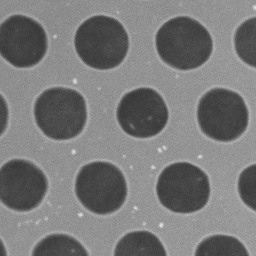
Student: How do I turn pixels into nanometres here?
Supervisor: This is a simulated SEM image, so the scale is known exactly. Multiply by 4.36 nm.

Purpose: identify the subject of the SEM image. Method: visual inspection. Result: holes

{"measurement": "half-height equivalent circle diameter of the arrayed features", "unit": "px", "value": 52.9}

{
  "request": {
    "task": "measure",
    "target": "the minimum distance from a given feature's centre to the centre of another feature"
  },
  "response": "356 nm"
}